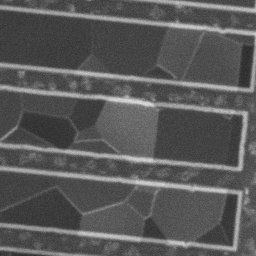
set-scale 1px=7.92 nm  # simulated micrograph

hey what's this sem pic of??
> one or a few lines or trenches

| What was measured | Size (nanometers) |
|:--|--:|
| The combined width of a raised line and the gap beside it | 628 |